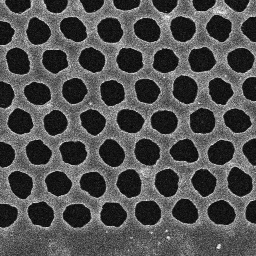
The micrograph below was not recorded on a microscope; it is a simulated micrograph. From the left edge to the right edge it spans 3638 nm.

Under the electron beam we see a regular array of holes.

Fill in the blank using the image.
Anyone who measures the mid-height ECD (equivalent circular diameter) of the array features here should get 363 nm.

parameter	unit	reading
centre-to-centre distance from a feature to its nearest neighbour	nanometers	491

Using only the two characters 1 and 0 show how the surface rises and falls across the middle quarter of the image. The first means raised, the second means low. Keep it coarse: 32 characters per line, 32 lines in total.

01110000001111000000110000001111
11111100001111000001111000001111
11111111111111111111111111111111
11111111111111111111111111110000
00000111110001111100000111100000
00000111100000011100000111100000
00000011100000011100000011100000
00000011100000011100000011100000
00000111100000011100000111110000
10001111110000111110000111111000
11111111111011111111111111111111
11111100111111000111111111111111
11110000011110000001110000001111
01110000001110000000110000001110
01110000000110000000110000000110
01110000001111000000110000001110
11111100001111000001111000001111
11111100011111111111111100111111
11111111111111111111111111111111
00001111110001111100001111110000
00000111100000111100000011100000
00000011100000011100000011000000
00000011100000011100000011000000
00000111100000011100000011100000
00000111110000011110000111111110
11111111111100111111101111111111
11111111111111110011111110011111
11111000011111000001111000001111
01110000001110000001111000000111
00110000001110000001111000000111
00110000000110000001111000000111
01111000001111000001111000001111